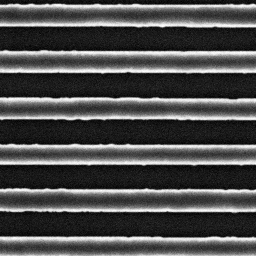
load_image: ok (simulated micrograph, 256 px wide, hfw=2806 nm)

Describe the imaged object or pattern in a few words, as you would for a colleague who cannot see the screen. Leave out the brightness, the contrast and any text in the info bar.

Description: lines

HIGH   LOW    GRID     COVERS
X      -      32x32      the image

--------------------------------
XXXXXXXXXXXXXXXXXXXXXXXXXXXXXXXX
XXXXXXXXXXXXXXXXXXXXXXXXXXXXXXXX
--------------------------------
--------------------------------
--------------------------------
XXXXXXXXXXXXXXXX----------------
XXXXXXXXXXXXXXXXXXXXXXXXXXXXXXXX
XXXXXXXXXXXXXXXXXXXXXXXXXXXXXXXX
--------------------------------
--------------------------------
--------------------------------
XXXXXXXXXXXXXXXXXXXXXXXXXXX---X-
XXXXXXXXXXXXXXXXXXXXXXXXXXXXXXXX
XXXXXXXXXXXXXXXXXXXXXXXXXXXXXXXX
--------------------------------
--------------------------------
--------------------------------
XXXXXXXXXXXXXXXXXXXXXXXXXXXXXXXX
XXXXXXXXXXXXXXXXXXXXXXXXXXXXXXXX
--------------------------------
--------------------------------
--------------------------------
--------------------------------
XXXXXXXXXXXXXXXXXXXXXXXXXXXXXXXX
XXXXXXXXXXXXXXXXXXXXXXXXXXXXXXXX
--------------------------------
--------------------------------
--------------------------------
--------------------------------
XXXXXXXXXXXXXXXXXXXXXXXXXXXXXXXX
XXXXXXXXXXXXXXXXXXXXXXXXXXXXXXXX